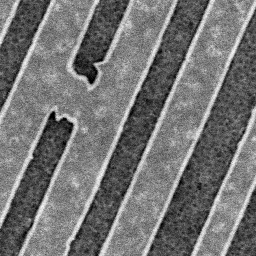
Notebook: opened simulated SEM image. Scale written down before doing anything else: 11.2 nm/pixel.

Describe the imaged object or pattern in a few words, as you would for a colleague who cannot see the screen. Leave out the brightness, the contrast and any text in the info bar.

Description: one or a few lines or trenches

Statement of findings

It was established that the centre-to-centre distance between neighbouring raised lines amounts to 822 nm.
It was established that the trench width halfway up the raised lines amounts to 365 nm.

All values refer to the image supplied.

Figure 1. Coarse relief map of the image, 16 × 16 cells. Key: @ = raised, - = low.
@--@@@--@@@--@@@
---@@---@@---@@-
--@@@--@@@--@@@-
--@@@--@@@--@@--
-@@@@-@@@--@@@--
-@@@@@@@@--@@@--
@@@@@@@@--@@@---
@@@-@@@@--@@@---
@@--@@@---@@---@
@@--@@@--@@@---@
@---@@@--@@---@@
@--@@@--@@@---@@
@--@@@--@@@---@-
--@@@--@@@---@@-
--@@@--@@@---@@-
-@@@---@@---@@--